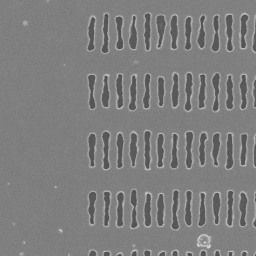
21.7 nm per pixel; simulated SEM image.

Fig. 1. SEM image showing a regular array of holes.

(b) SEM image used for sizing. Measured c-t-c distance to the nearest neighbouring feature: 299 nm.